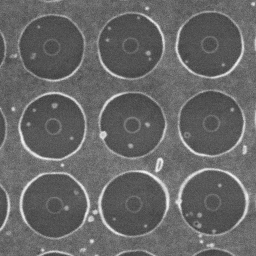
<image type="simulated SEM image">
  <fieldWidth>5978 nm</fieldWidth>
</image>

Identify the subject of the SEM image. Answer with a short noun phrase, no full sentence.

an array of small figures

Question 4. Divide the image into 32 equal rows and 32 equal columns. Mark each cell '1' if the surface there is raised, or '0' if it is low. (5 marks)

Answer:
11111111111111111111111111111111
11111111111111111111111111011111
11110000011111000001111100000111
11100000001110000000111000000011
11100000001100000000110000000011
01000000000100000000010000000011
01000000001100000000110000000011
11100000001110000000111000000011
11100000001110000001111000000111
11110000011111100011111110011111
11111111111111111111111111111111
11111111111111111111111110011111
11110000011111000001111100000111
11100000001110000000111000000011
11100000000110000000010000000011
01100000000100000000010000000001
01100000000110000000010000000011
01100000001110000000111000000011
11100000001111000001111100000111
11111000011111100011111111011111
11111111111111111111111111111111
11111111111111110011111110001111
11110000011111000000111000000011
11100000001110000000011000000011
01100000000110000000011000000001
01100000000100000000011000000001
01100000000110000000011000000001
01100000000110000000111000000011
11110000001111000001111100000111
11111000111111110111111111111111
11111111111111111111111111111111
11111101111111110011111110001111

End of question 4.